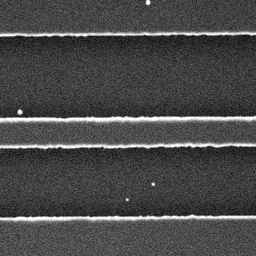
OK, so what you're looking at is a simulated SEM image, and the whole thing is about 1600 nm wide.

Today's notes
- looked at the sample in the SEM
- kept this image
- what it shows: lines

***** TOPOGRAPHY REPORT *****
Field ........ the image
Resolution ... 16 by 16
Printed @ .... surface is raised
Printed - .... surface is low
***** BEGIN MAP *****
@@@@@@@@@@@@@@@@
@@@@@@@@@@@@@@@@
----------------
----------------
----------------
----------------
----------------
@@@@@@@@@@@@@@@@
@@@@@@@@@@@@@@@@
----------------
----------------
----------------
----------------
----------------
@@@@@@@@@@@@@@@@
@@@@@@@@@@@@@@@@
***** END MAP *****